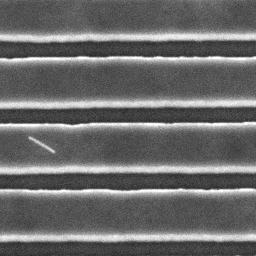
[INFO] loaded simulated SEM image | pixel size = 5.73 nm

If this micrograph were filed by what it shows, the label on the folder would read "lines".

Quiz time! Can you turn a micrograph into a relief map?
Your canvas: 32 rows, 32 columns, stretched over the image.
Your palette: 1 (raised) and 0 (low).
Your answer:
11111111111111111111111111111111
11111111111111111111111111111111
11111111111111111111111111111111
11111111111111111111111111111111
11111111111111111111111111111111
00000000000000000000000000000000
00000000000000000000000000000000
11111111111111111111111111111111
11111111111111111111111111111111
11111111111111111111111111111111
11111111111111111111111111111111
11111111111111111111111111111111
11111111111111111111111111111111
00000000000000000000000000000000
00000000000000000000000000000000
00000000000111111111011111111111
11111111111111111111111111111111
11111111111111111111111111111111
11111111111111111111111111111111
11111111111111111111111111111111
11111111111111111111111111111111
00000000000000000000000000000000
00000000000000000000000000000000
00000000000000000000000000000000
11111111111111111111111111111111
11111111111111111111111111111111
11111111111111111111111111111111
11111111111111111111111111111111
11111111111111111111111111111111
11111111111111111111111111111111
00000000000000000000000000000000
00000000000000000000000000000000